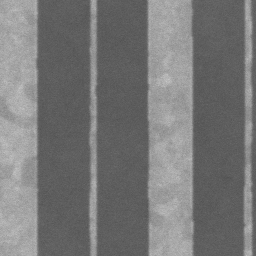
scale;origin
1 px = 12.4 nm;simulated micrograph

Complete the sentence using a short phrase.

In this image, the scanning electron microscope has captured lines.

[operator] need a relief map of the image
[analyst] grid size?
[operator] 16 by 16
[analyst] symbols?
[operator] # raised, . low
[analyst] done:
##.......###....
##.......###....
##.......###....
##.......###....
##.......###....
##.......###....
##.......###....
##.......###....
##.......###....
##.......###....
##.......###....
##.......###....
##.......###....
##.......###....
##.......###....
##.......###....